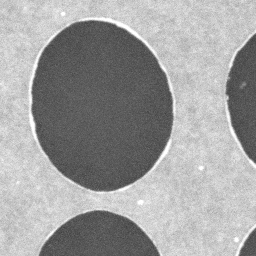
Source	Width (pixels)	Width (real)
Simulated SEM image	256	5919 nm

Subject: holes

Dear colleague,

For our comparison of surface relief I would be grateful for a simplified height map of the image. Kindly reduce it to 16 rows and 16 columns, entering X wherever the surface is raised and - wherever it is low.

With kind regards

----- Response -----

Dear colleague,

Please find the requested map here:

XXXXXXXXXXXXXXXX
XXXX---XXXXXXXXX
XXX------XXXXXX-
XX--------XXXXX-
XX--------XXXX--
XX---------XXX--
XX---------XXX--
XX---------XXX--
XX---------XXXX-
XXX-------XXXXX-
XXX-------XXXXXX
XXXXX---XXXXXXXX
XXXXXXXXXXXXXXXX
XXXXX---XXXXXXXX
XXX------XXXXXXX
XXX-------XXXXX-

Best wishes